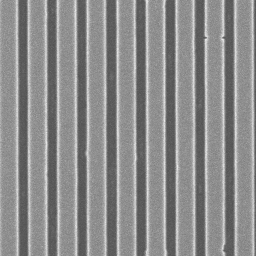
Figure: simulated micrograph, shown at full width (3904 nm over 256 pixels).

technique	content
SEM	parallel lines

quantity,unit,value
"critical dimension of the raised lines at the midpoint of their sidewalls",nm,292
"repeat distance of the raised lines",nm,450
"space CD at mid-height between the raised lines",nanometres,160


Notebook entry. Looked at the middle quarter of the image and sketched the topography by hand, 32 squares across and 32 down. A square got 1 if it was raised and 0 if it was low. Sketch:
11100011110001111100011110001111
11100011110001111100011110001111
11100011110001111100011110001111
11100011110001111100011110001111
11100011110001111100011110001111
11100011110001111100011110001111
11100011110001111100011110001111
11100011110001111100011110001111
11100011110001111100011110001111
11100011110001111100011110001111
11100011110001111100011110001111
11100011110001111100011110001111
11100011110001111100011110001111
11100011110001111100011110001111
11100011110001111100011110001111
11100011110001111100011110001111
11100011110001111100011110001111
11100011110001111100011110001111
11100011110001111100011110001111
11100011110001111100011110001111
11100011110001111100011110001111
11100011110001111100011110001111
11100011110001111100011110001111
11100011110001111100011110001111
11100011110001111100011110001111
11100011110000111100011110001111
11100011110000111100011110001111
11100011110000111100011110001111
11100011110000111100011110001111
11100011110000111100011110001111
11100011110000111100011110001111
11100011110001111100011110001111